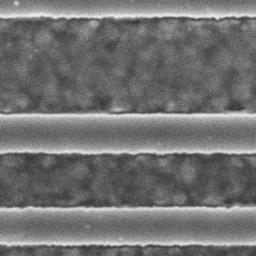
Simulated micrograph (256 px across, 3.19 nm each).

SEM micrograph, lines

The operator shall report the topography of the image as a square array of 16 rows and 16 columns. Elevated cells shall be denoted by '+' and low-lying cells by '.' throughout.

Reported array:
++++++++++++++++
................
................
................
................
................
................
++++++++++++++++
++++++++++++++++
++++++++++++++++
................
................
................
++++++++++++++++
++++++++++++++++
................